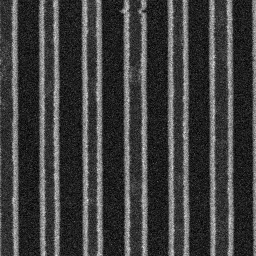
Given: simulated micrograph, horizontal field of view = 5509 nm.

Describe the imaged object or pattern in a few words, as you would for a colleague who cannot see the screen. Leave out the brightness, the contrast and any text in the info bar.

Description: parallel lines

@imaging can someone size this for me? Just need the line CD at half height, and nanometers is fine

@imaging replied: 331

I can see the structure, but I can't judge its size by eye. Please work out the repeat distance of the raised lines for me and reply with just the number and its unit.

0.925 micrometres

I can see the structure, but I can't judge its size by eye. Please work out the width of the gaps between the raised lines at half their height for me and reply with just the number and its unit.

568 nm